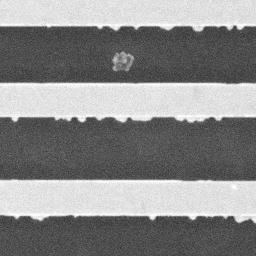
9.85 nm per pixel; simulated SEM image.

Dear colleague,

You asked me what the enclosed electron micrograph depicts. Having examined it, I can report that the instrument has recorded lines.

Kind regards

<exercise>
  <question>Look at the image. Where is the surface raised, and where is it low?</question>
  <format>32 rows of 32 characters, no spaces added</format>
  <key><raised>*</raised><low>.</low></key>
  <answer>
********************************
********************************
********************************
................................
................................
................................
................................
................................
................................
................................
****************************.***
********************************
********************************
********************************
********************************
................................
................................
................................
................................
................................
................................
................................
................................
********************************
********************************
********************************
********************************
................................
................................
................................
................................
................................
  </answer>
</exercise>